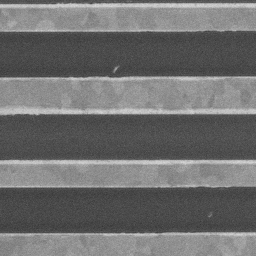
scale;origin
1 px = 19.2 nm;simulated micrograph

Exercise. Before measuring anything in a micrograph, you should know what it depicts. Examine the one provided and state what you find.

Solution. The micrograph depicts lines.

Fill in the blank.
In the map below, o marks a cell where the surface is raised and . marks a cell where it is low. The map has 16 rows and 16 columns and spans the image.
oooooooooooooooo
oooooooooooooooo
................
................
................
oooooooooooooooo
oooooooooooooooo
................
................
................
oooooooooooooooo
oooooooooooooooo
................
................
................
oooooooooooooooo